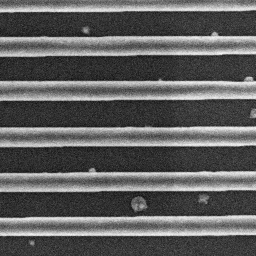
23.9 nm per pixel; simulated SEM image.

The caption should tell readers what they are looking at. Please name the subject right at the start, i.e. lines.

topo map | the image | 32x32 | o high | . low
oooooooooooooooooooooooooooooooo
................................
................................
................................
................................
oooooooooooooooooooooooooooooooo
oooooooooooooooooooooooooooooooo
................................
................................
................................
oooooooooooooooooooooooooooooooo
oooooooooooooooooooooooooooooooo
................................
................................
................................
................................
oooooooooooooooooooooooooooooooo
oooooooooooooooooooooooooooooooo
................................
................................
................................
................................
oooooooooooooooooooooooooooooooo
oooooooooooooooooooooooooooooooo
................................
................................
................................
oooooooooooooooooooooooooooooooo
oooooooooooooooooooooooooooooooo
................................
................................
................................